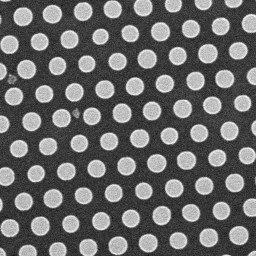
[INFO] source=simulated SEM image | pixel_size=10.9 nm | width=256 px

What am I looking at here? an array of small figures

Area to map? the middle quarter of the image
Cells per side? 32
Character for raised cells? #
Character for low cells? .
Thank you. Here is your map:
....####....###....###..........
....###.........................
................................
........................###....#
.........##.....####...####....#
.###....####....####...####....#
.####...####....####....###.....
.####...####.....#..............
.###......#.....................
............................###.
.............###....####....####
......##....#####...####....####
#....####...#####...####....###.
##...####....####....##.........
#....###......#.................
#...............................
.........................###....
..........##.....####...####....
..###....####....####...####....
..####...####....####....###....
..####....###.....##............
...##...........................
.............................###
...............#.....####...####
.......##.....####...####...####
##....####....####...####....###
###...####....###.....###.......
###....###.....#................
##..............................
..........................###...
............#.....###....#####..
...###.....###....####...#####..